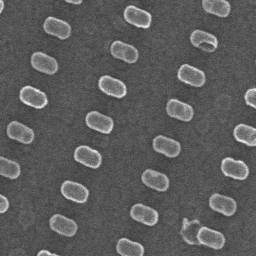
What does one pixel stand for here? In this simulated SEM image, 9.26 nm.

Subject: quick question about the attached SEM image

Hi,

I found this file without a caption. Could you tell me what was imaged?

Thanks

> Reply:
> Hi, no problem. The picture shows a regular array of raised bodies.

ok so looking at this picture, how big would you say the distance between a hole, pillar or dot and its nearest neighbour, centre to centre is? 337 nanometers